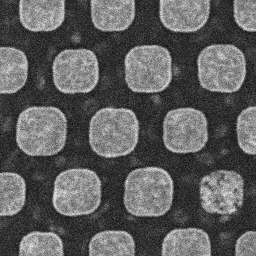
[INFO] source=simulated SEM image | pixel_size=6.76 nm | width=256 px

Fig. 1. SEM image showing a regular array of raised bodies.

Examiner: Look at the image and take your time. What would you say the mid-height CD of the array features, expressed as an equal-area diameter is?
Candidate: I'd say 328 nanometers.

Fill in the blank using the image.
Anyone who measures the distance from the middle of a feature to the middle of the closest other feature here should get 0.471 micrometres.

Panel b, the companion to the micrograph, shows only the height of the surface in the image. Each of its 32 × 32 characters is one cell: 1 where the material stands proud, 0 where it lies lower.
00011111000111111000111111000111
00011111000011111000111111000111
00011111000011110000111111000011
00011110000011110000011110000011
00000000000000000000000000000000
00000000000000000000000000000000
11100000111000001111100001111100
11100001111100001111100001111100
11100001111100001111100001111100
11100001111100001111100001111100
11100001111100001111100001111100
11000000000000000000000000001000
00000000000000000000000000000000
00001110000000000000000000000001
00011111000011111000011110000011
00111111000111111000111111000011
00111111000111111000111111000011
00111111000111111000111111000011
00011111000011111000011110000011
00000000000000000000000000000000
00000000000000000000000000000000
00000000111100000111100000000000
11100001111100001111100000000000
11100001111100001111100000000000
11100001111100001111100000000000
11100001111100001111100000000000
11000001111000001111100000000000
00000000000000000000000000000000
00000000000000000000000000000000
00011110000011110000011111000011
00011111000111111000111111000011
00111111000111111000111111000011